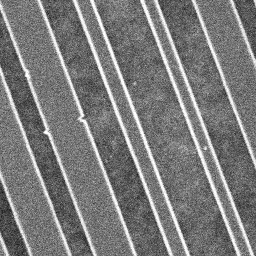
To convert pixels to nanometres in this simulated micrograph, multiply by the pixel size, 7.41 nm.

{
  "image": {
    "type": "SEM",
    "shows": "one or a few lines or trenches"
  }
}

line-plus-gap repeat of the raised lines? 450 nanometers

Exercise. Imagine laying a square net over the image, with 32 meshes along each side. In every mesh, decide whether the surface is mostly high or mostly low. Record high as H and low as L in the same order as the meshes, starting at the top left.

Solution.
HHHHHLLLLHHHLLLLLLHHLLLLHHHHHLLL
HHHHHHLLLLHHLLLLLLHHLLLLLHHHHHLL
LHHHHHLLLLHHLLLLLLLHLLLLLHHHHHLL
LHHHHHLLLLLHHLLLLLLHHLLLLHHHHHLL
LHHHHHHLLLLHHLLLLLLHHLLLLLHHHHHL
LLHHHHHLLLLHHHLLLLLLHHLLLLHHHHHL
LLHHHHHLLLLLHHLLLLLLHHLLLLLHHHHL
LLLHHHHHLLLLHHLLLLLLLHLLLLLHHHHH
LLLHHHHHLLLLHHHLLLLLLHHLLLLHHHHH
LLLHHHHHHLLLLHHLLLLLLHHLLLLLHHHH
HLLLHHHHHLLLLHHLLLLLLLHLLLLLHHHH
HLLLHHHHHLLLLLHHLLLLLLHHLLLLHHHH
HLLLHHHHHHLLLLHHLLLLLLHHLLLLLHHH
HHLLLHHHHHLLLLHHHLLLLLLHHLLLLHHH
HHLLLHHHHHLLLLLHHLLLLLLHHLLLLLHH
HHHLLLHHHHHLLLLHHLLLLLLLHLLLLLHH
HHHLLLHHHHHLLLLLHHLLLLLLHHLLLLHH
HHHLLLHHHHHHLLLLHHLLLLLLHHLLLLLH
HHHHLLLHHHHHLLLLHHHLLLLLLHHLLLLH
HHHHLLLHHHHHLLLLLHHLLLLLLHHLLLLH
HHHHLLLHHHHHHLLLLHHLLLLLLHHLLLLL
HHHHHLLLHHHHHLLLLHHHLLLLLLHHLLLL
HHHHHLLLHHHHHLLLLLHHLLLLLLHHLLLL
LHHHHHLLLHHHHHLLLLHHLLLLLLLHLLLL
LHHHHHLLLHHHHHLLLLLHHLLLLLLHHLLL
LHHHHHLLLHHHHHHLLLLHHLLLLLLHHLLL
LLHHHHHLLLHHHHHLLLLHHHLLLLLLHHLL
LLHHHHHLLLHHHHHLLLLLHHLLLLLLHHLL
LLHHHHHHLLHHHHHHLLLLHHLLLLLLLHLL
LLLHHHHHLLLHHHHHLLLLHHHLLLLLLHHL
LLLHHHHHLLLHHHHHLLLLLHHLLLLLLHHL
HLLLHHHHHLLLHHHHHLLLLHHLLLLLLLHL